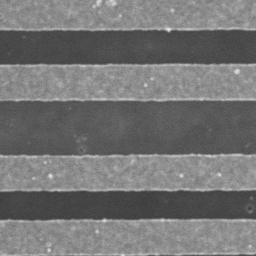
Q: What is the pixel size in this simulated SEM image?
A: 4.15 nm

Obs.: lines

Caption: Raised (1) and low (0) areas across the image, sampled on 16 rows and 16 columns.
1111111111111111
1111111111111111
0000000000000000
0000000000000000
1111111111111111
1111111111111111
0000000000000000
0000000000000000
0000000000000000
0000000000000000
1111111111111111
1111111111111111
0000000000000000
0000000000000000
1111111111111111
1111111111111111